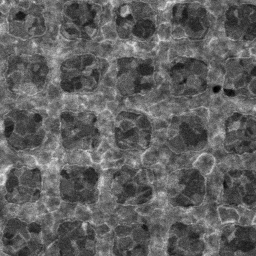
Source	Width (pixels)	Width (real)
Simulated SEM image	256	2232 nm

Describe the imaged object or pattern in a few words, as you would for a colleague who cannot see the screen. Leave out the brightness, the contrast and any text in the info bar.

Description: a regular array of raised bodies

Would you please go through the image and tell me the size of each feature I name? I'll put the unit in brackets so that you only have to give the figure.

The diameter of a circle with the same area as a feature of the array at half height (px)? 42.1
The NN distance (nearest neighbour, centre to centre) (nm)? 469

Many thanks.